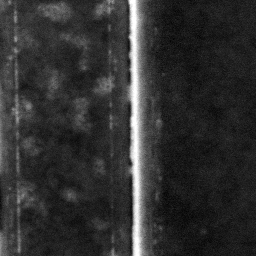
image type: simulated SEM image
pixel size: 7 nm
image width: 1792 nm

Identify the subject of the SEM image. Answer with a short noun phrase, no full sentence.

one or a few lines or trenches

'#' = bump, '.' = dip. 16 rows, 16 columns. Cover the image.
########........
########........
########........
########........
########........
########........
########........
########........
########........
########........
########........
#########.......
#########.......
#########.......
#########.......
#########.......